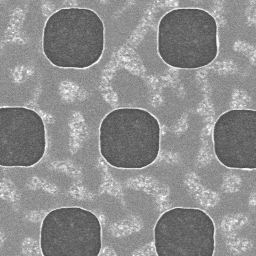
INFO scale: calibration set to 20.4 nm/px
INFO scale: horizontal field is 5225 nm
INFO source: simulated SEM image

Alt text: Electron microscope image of holes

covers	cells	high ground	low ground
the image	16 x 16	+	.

++++++++++++++++
+++...++++...+++
+++...++++....++
+++...++++...+++
++++++++++++++++
++++++++++++++++
++++++++++++++++
...+++....++++..
...+++....+++...
...+++....+++...
+++++++++++++++.
++++++++++++++++
++++++++++++++++
+++...++++...+++
+++...++++...+++
+++...++++...+++